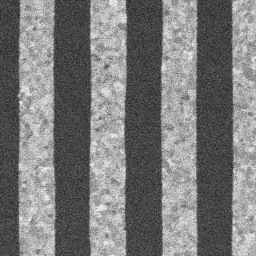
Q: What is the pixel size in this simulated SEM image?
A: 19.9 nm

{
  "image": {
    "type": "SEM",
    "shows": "one or a few lines or trenches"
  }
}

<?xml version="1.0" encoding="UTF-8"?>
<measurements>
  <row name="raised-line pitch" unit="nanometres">1420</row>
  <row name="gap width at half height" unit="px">37.4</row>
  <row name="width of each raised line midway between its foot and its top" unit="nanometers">669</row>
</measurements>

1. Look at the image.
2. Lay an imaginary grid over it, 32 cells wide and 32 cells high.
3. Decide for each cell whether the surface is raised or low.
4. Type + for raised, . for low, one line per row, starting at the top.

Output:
...++++....+++++....++++.....+++
...++++....+++++....++++.....+++
...++++....+++++....++++.....+++
...++++....+++++....++++.....+++
...++++....+++++....++++.....+++
...++++....+++++....++++.....+++
...++++....+++++....++++.....+++
...++++....+++++....++++.....+++
...++++.....++++....++++.....+++
..+++++....+++++....++++.....+++
...++++.....++++....++++.....+++
..+++++.....++++....++++.....+++
..+++++.....++++....++++.....+++
...++++....++++.....++++.....+++
...++++....++++.....++++.....+++
...++++....++++.....++++.....+++
...++++....++++.....++++.....+++
...++++....++++.....++++.....+++
...++++....++++.....++++.....+++
...++++....+++++....++++.....+++
..+++++....+++++....++++.....+++
..+++++....+++++....++++.....+++
..+++++....+++++....++++.....+++
..+++++....+++++....++++.....+++
..+++++....+++++....++++.....+++
..+++++....+++++....++++.....+++
..+++++....++++.....++++.....+++
..+++++....+++++....++++.....+++
...++++....++++.....++++.....+++
..+++++....+++++....+++++....+++
...++++....+++++....+++++....+++
...++++....+++++....++++.....+++